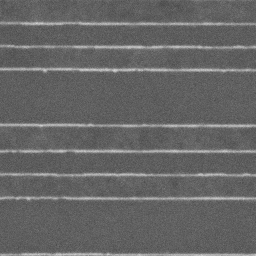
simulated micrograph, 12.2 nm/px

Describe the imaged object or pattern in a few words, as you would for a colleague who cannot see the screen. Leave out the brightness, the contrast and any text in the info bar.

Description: lines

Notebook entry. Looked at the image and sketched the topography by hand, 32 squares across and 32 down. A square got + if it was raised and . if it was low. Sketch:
++++++++++++++++++++++++++++++++
++++++++++++++++++++++++++++++++
++++++++++++++++++++++++++++++++
................................
................................
................................
++++++++++++++++++++++++++++++++
++++++++++++++++++++++++++++++++
++++++++++++++++++++++++++++++++
................................
................................
................................
................................
................................
................................
................................
++++++++++++++++++++++++++++++++
++++++++++++++++++++++++++++++++
++++++++++++++++++++++++++++++++
................................
................................
................................
++++++++++++++++++++++++++++++++
++++++++++++++++++++++++++++++++
++++++++++++++++++++++++++++++++
................................
................................
................................
................................
................................
................................
................................